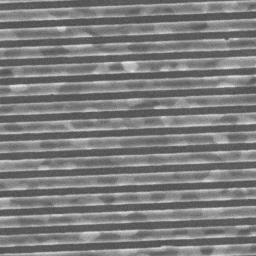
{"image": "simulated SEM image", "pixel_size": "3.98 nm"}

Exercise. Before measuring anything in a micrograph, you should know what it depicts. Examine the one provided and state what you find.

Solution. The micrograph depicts parallel lines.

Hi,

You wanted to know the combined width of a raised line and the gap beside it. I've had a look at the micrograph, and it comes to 74.4 nanometres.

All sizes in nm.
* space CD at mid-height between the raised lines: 30.3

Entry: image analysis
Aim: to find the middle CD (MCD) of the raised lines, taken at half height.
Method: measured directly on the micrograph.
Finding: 41.7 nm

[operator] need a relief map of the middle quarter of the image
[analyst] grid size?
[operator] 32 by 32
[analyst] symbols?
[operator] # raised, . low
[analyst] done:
################################
##########################......
#######.........................
................................
...........#####################
################################
#####################...........
................................
.........................##..###
.###.###########################
################################
###############.................
................................
..................##############
################################
################################
#######.........................
................................
............####################
################################
######################..........
................................
.............................###
..##############################
################################
################................
................................
...................#############
################################
################################
######..##......................
................................